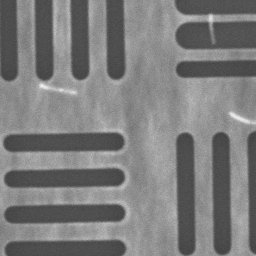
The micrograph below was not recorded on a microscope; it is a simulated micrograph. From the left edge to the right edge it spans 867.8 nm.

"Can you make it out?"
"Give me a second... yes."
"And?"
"groups of lines, slits or small figures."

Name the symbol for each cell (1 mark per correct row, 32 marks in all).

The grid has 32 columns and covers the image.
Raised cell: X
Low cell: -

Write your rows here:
--XX---XX--XX---XXXXXX----------
--XX---XX--XX---XXXXXX----------
--XX---XX--XX---XXXXXXXXXXXXXXXX
--XX---XX--XX---XXXXXX----------
--XX---XX--XX---XXXXXX----------
--XX---XX--XX---XXXXXX----------
--XX---XX--XX---XXXXXXXXXXXXXXXX
--XX---XX--XX---XXXXXXXXXXXX----
--XX---XX--XX---XXXXXX----------
--XXX--XX--XXX-XXXXXXX----------
XXXXXXXXXXXXXXXXXXXXXXXXXXXXXXXX
XXXXXXXXXXXXXXXXXXXXXXXXXXXXXXXX
XXXXXXXXXXXXXXXXXXXXXXXXXXXXXXXX
XXXXXXXXXXXXXXXXXXXXXXXXXXXXXXXX
XXXXXXXXXXXXXXXXXXXXXXXXXXXXXXXX
XXXXXXXXXXXXXXXXXXXXXXXXXXXXXXXX
XXXXXXXXXX----XXXXXXXXXXXXX-XXXX
----------------XXXXXX--XX---XX-
X--------------XXXXXXX--XX---XX-
XXXXXXXXXXXXXXXXXXXXXX--XX---XX-
XXXXXXXXXXXXXXXXXXXXXX--XX---XX-
X--------------XXXXXXX--XX---XX-
X---------------XXXXXX--XX---XX-
XX-XXXXXXXXXXXXXXXXXXX--XX---XX-
XXXXXXXXXXXXXXXXXXXXXX--XX---XX-
XXXXXX---------XXXXXXX--XXX--XX-
X---------------XXXXXX--XXX--XX-
X--------------XXXXXXX--XXX--XX-
XXXXXXXXXXXXXXXXXXXXXX--XXX--XX-
XXXXXXXXXXXXXXXXXXXXXX--XXX--XX-
X---------------XXXXXX--XXX--XX-
X---------------XXXXXX--XXX--XX-